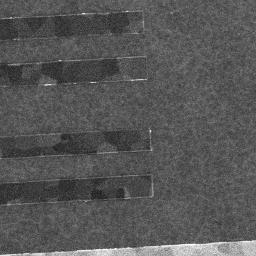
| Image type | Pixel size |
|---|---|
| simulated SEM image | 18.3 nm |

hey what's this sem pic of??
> parallel lines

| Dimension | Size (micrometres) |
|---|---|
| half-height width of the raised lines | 0.403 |